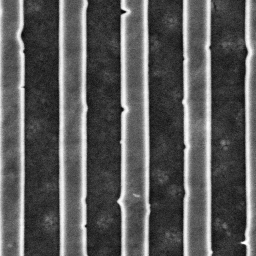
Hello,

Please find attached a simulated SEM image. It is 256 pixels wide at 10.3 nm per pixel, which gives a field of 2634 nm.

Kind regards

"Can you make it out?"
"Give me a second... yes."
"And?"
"parallel lines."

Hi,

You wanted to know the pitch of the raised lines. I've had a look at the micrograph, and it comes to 640 nanometers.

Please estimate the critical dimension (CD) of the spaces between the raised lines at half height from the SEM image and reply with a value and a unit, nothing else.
377 nm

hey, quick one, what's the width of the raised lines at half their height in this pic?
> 257 nm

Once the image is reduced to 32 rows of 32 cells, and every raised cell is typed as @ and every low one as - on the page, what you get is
@@@-----@@@----@@@-----@@@-----@
@@@-----@@@-----@@-----@@@-----@
@@@-----@@@----@@@-----@@@-----@
@@@-----@@@----@@@-----@@@-----@
@@@-----@@@----@@@-----@@@-----@
@@@-----@@@----@@@-----@@@-----@
@@@-----@@@----@@@-----@@@-----@
@@@-----@@@----@@@-----@@@-----@
@@@-----@@@----@@@-----@@@-----@
@@@-----@@@----@@@-----@@@-----@
@@@-----@@@----@@@-----@@@-----@
@@@-----@@@----@@@-----@@@-----@
@@@-----@@@----@@@-----@@@-----@
@@@-----@@@----@@@-----@@@-----@
@@@-----@@@----@@@-----@@@-----@
@@@-----@@@----@@@-----@@@-----@
@@@-----@@@----@@@-----@@@-----@
@@@-----@@@----@@@-----@@@-----@
@@@-----@@@----@@@-----@@@-----@
@@@-----@@@----@@@-----@@@-----@
@@@-----@@@----@@@-----@@@-----@
@@@-----@@@----@@@-----@@@-----@
@@@-----@@@----@@@-----@@@-----@
@@@-----@@@----@@@-----@@@-----@
@@@-----@@@----@@@-----@@@-----@
@@@-----@@@----@@@@----@@@-----@
@@@-----@@@----@@@@----@@@-----@
@@@-----@@@----@@@@----@@@-----@
@@@-----@@@----@@@-----@@@-----@
@@@-----@@@----@@@-----@@@-----@
@@@-----@@@----@@@-----@@@-----@
@@@-----@@@----@@@-----@@@-----@